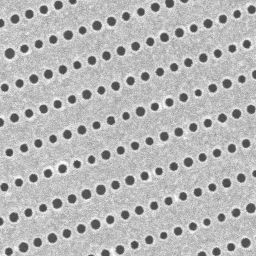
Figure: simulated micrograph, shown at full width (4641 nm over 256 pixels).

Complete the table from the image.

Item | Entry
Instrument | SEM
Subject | a regular array of holes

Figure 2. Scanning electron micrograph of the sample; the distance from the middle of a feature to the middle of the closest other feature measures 274 nanometres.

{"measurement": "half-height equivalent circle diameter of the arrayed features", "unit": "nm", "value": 166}